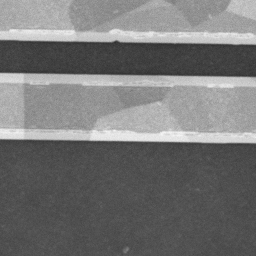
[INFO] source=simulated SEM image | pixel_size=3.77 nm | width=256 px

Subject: one or a few lines or trenches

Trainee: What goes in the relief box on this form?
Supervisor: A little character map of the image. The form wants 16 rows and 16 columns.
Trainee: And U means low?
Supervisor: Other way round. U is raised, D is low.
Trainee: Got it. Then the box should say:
UUUUUUUUUUUUUUUU
UUUUUUUUUUUUUUUU
DDDDDDDDDDDDDDUD
DDDDDDDDDDDDDDDD
DDDDDDDDDDDDDDDD
UUUUUUUUUUUUUUUU
UUUUUUUUUUUUUUUU
UUUUUUUUUUUUUUUU
DDDUUUUUUUUUUUUU
DDDDDDDDDDDDDDDD
DDDDDDDDDDDDDDDD
DDDDDDDDDDDDDDDD
DDDDDDDDDDDDDDDD
DDDDDDDDDDDDDDDD
DDDDDDDDDDDDDDDD
DDDDDDDDDDDDDDDD